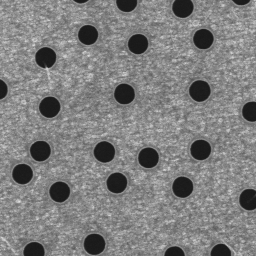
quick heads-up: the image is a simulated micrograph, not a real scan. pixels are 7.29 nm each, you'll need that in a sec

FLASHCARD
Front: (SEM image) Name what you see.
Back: a regular array of holes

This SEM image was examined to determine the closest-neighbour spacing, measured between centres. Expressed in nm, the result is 315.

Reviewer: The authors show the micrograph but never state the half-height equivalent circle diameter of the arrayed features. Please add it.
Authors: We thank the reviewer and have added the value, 151 nm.